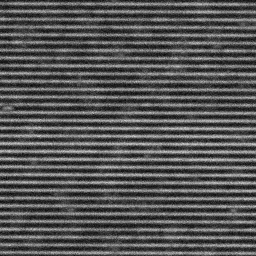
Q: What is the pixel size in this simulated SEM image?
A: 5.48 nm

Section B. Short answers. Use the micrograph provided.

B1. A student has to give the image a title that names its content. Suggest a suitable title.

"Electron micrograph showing parallel lines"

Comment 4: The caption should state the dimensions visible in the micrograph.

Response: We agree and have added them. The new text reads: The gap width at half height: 34.2 nanometres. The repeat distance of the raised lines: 0.0426 micrometres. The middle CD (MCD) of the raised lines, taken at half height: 8.2 nanometres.